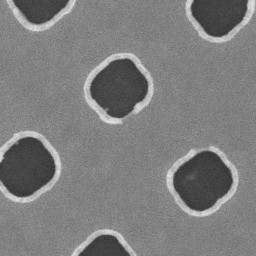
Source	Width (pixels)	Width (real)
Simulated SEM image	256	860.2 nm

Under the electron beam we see holes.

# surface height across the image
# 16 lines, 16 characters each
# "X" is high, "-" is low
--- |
X---XXXXXXXX---X
XX-XXXXXXXXX---X
XXXXXXXXXXXXXXXX
XXXXXXXXXXXXXXXX
XXXXXX---XXXXXXX
XXXXXX---XXXXXXX
XXXXXX---XXXXXXX
XXXXXXXXXXXXXXXX
XXXXXXXXXXXXXXXX
---XXXXXXXXXXXXX
---XXXXXXXX---XX
---XXXXXXXX---XX
XXXXXXXXXXX---XX
XXXXXXXXXXXXXXXX
XXXXXXXXXXXXXXXX
XXXXX---XXXXXXXX